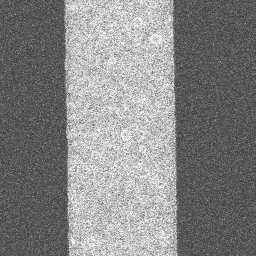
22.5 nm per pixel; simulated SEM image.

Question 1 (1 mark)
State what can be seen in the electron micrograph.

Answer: one or a few lines or trenches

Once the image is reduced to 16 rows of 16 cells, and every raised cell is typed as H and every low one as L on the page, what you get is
HHHHLLLLLLLHHHHH
HHHHLLLLLLLHHHHH
HHHHLLLLLLLHHHHH
HHHHLLLLLLLHHHHH
HHHHLLLLLLLHHHHH
HHHHLLLLLLLHHHHH
HHHHLLLLLLLHHHHH
HHHHLLLLLLLHHHHH
HHHHLLLLLLLHHHHH
HHHHLLLLLLLHHHHH
HHHHLLLLLLLHHHHH
HHHHLLLLLLLHHHHH
HHHHLLLLLLLHHHHH
HHHHLLLLLLLHHHHH
HHHHLLLLLLLHHHHH
HHHHLLLLLLLHHHHH